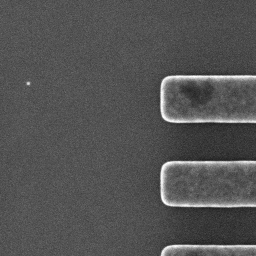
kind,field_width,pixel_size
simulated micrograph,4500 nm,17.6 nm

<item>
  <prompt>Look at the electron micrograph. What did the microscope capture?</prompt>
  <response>wiring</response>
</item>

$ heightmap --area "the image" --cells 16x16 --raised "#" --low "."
................
................
................
................
................
..........######
..........######
...........#####
................
................
..........######
..........######
..........######
................
................
..........######